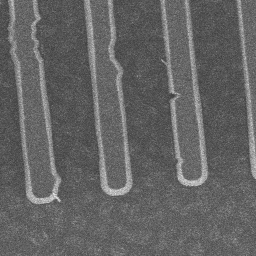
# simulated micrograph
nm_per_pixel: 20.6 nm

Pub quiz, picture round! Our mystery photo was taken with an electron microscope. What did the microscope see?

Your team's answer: one or a few lines or trenches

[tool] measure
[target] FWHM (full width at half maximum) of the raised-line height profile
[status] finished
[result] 546 nm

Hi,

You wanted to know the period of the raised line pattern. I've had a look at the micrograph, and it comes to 1560 nanometres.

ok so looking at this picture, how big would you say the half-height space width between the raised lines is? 1010 nm